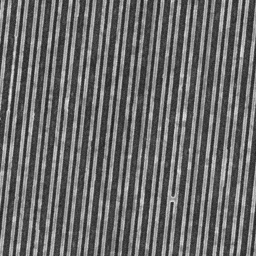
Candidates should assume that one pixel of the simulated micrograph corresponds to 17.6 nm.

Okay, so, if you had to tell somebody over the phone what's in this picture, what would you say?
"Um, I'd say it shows parallel lines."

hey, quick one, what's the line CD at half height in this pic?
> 0.0482 um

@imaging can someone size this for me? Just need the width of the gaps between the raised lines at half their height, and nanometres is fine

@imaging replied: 105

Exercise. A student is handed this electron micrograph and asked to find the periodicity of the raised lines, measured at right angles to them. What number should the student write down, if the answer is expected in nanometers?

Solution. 149